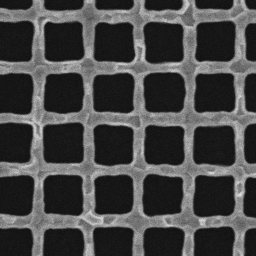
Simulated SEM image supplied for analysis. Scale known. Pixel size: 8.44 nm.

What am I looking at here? a regular array of holes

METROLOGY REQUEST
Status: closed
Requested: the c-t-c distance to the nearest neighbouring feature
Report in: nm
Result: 422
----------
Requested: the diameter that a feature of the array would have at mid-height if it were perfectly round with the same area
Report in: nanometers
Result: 370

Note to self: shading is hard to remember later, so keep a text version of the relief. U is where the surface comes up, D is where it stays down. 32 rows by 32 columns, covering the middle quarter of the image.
UUUUUUUUUUUUUUUUUUUUUUUUUUUUUUUU
UUUUUUUUUUUUUUUUUUUUUUUUUUUUUUUU
DDDDUUUUUUDUUDDDDUUUUDDDDDDDDUUU
DDDDDUUUDDDDDDDDDUUUDDDDDDDDDDUU
DDDDDUUDDDDDDDDDDDUUDDDDDDDDDDUU
DDDDDUUDDDDDDDDDDDUUDDDDDDDDDDUU
DDDDDUUDDDDDDDDDDUUUDDDDDDDDDDUU
DDDDDUUDDDDDDDDDDUUUDDDDDDDDDDDU
DDDDDUUDDDDDDDDDDUUUDDDDDDDDDDUU
DDDDDUUDDDDDDDDDDUUUDDDDDDDDDDUU
DDDDDUUDDDDDDDDDDUUUDDDDDDDDDDUU
DDDDUUUDDDDDDDDDDUUUDDDDDDDDDUUU
UUUUUUUUUUUUUUUUUUUUUUUUUUUUUUUU
UUUUUUUUUUUUUUUUUUUUUUUUUUUUUUUU
UUUDUUUUUUUUUUUUUUUUUUUUUUUUUUUU
DDDDDUUUDDDDDDDDUUUUUDDDUUDDDUUU
DDDDDUUDDDDDDDDDDUUUDDDDDDDDDDUU
DDDDDUUDDDDDDDDDDUUUDDDDDDDDDDUU
DDDDDUUDDDDDDDDDDUUUDDDDDDDDDDUU
DDDDDUUDDDDDDDDDDUUUDDDDDDDDDDUU
DDDDDUUUDDDDDDDDDUUUDDDDDDDDDDUU
DDDDDUUUDDDDDDDDDUUUDDDDDDDDDDUU
DDDDDUUUDDDDDDDDDUUUDDDDDDDDDDUU
DDDDDUUUDDDDDDDDDUUUDDDDDDDDDDUU
DDDDUUUUDDDDDDDDDUUUUDDDDDDDDDUU
UUUUUUUUUUDDUUUUUUUUUUUUUUUUUUUU
UUUUUUUUUUUUUUUUUUUUUUUUUUUUUUUU
UUUUUUUUUUUUUUUUUUUUUDDUUUUUUUUU
DDDDUUUUDDDDDDDDDUUUDDDDDDDDDUUU
DDDDDUUDDDDDDDDDDUUUDDDDDDDDDDUU
DDDDDUUUDDDDDDDDDUUUDDDDDDDDDDUU
DDDDDUUUDDDDDDDDDDUUDDDDDDDDDDUU